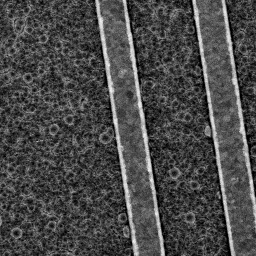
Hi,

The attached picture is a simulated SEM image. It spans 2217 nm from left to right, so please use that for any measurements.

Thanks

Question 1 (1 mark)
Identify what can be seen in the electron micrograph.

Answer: one or a few lines or trenches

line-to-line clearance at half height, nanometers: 594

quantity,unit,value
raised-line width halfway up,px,27.7